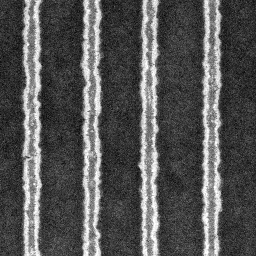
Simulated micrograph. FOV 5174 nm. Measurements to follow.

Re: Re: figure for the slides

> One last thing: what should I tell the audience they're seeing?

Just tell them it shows parallel lines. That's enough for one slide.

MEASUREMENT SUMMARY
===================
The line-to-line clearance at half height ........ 49.4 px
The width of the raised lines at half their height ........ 222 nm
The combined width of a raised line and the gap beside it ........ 1210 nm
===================